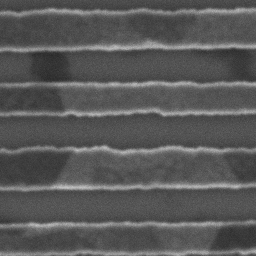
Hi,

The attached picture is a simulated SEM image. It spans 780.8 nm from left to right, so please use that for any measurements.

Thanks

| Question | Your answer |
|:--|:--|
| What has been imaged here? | lines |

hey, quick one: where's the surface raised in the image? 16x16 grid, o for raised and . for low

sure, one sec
................
oooooooooooooooo
oooooooooooooooo
................
................
oooooooooooooooo
oooooooooooooooo
................
................
oooooooooooooooo
oooooooooooooooo
oooooooooooooooo
................
................
oooooooooooooooo
oooooooooooooooo